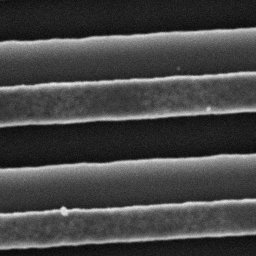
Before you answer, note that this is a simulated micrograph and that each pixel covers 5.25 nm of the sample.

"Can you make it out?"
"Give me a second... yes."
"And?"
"lines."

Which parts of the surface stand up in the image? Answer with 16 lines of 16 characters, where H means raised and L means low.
LLLLLLLLLLLLLLLL
LLLLLLLLLLLLLLLL
LLLHHHHHHHHHHHHH
HHHHHHHHHHHHHHHH
HHHHHHHHHHHHHHHH
HHHHHHHHHHHHHHHH
HHHHHHHHHHHHHHHH
HHHHHHHHLLLLLLLL
LLLLLLLLLLLLLLLL
LLLLLLLLLLLLLLLL
LLHHHHHHHHHHHHHH
HHHHHHHHHHHHHHHH
HHHHHHHHHHHHHHHH
HHHHHHHHHHHHHHHH
HHHHHHHHHHHHHHHH
HHLLLLLLLLLLLLLL